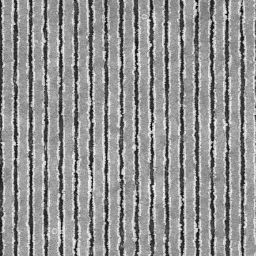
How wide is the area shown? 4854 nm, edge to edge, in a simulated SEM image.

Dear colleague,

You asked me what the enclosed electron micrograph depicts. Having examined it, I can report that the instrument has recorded parallel lines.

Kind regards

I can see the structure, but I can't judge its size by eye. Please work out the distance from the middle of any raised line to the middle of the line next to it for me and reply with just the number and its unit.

286 nanometers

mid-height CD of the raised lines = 0.225 um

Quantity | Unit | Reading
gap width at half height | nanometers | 66.4